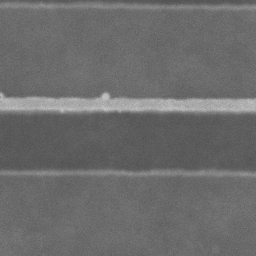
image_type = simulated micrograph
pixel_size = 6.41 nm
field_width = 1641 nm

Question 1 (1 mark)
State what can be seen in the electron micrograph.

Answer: lines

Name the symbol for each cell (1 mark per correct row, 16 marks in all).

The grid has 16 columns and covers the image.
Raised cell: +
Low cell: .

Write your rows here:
++++++++++++++++
++++++++++++++++
++++++++++++++++
++++++++++++++++
++++++++++++++++
++++++++++++++++
++++++++++++++++
................
................
................
................
++++++++++++++++
++++++++++++++++
++++++++++++++++
++++++++++++++++
++++++++++++++++